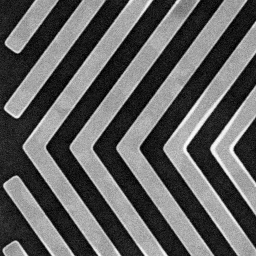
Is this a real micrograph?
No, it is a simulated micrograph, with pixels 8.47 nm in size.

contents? groups of lines, slits or small figures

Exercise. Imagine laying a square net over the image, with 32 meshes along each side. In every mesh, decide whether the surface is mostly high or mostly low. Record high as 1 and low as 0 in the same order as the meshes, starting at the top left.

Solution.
00001110001110001110001110001100
00011100011100011100011100011100
00011000011000111000111000111000
00111000111000111000110000110001
01110001110001110001110001110001
01100011100011100011100011100011
00000011000111000111000111000111
00000111000111000110001110001110
00001110001110001110001110001110
00011100011100011100011100011100
00011000011000111000111000111000
00111000111000111000110000110001
01110001110001110001110001100001
01100011100011100011100011100011
00000011000111000111000111000111
00000111000111000110000110000110
00001110001110001110001100001100
00011100011100011100011100011100
00011100011100011100011000011000
00001100011100011100011100011000
00001110001110001110001100001100
00000111000111000110001110001110
01100011000111000111000111000111
01100011100011100011100011000011
01110001110001110001100011100011
00111000110000110001110001110001
00011100111000111000111000111000
00011100011100011100011100011000
00001110001110001100001100011100
00000111001110001110001110001110
01000011000111000111000111000111
11100011100011100011100011000111